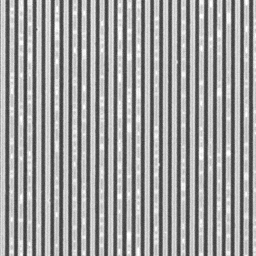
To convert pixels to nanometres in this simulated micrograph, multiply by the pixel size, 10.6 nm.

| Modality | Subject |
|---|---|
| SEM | parallel lines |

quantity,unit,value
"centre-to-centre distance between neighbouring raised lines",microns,0.0955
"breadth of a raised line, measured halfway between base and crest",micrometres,0.049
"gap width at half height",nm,49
